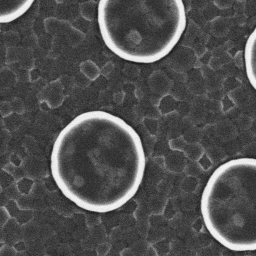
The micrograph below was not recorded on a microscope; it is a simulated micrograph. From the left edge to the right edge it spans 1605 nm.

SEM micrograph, raised bodies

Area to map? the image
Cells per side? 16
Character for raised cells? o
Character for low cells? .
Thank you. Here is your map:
oo....ooooo.....
......ooooo.....
.......oooo.....
........oo......
................
................
................
.....oo.........
....oooo........
...oooooo.......
...oooooo.....oo
....ooooo....ooo
.....ooo.....ooo
.............ooo
.............ooo
................